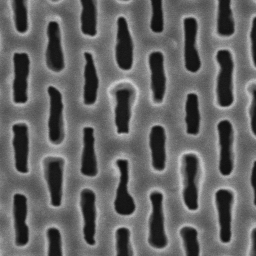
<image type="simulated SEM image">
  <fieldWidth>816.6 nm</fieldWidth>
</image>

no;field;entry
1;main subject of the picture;a regular array of holes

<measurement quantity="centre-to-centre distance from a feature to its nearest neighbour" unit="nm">143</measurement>